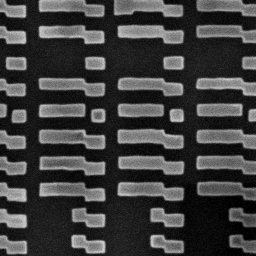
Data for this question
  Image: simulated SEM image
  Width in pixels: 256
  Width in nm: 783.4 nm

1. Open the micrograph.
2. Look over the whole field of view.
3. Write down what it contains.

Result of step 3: wiring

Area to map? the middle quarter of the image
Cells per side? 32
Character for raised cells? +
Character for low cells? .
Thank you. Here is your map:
......++++...............+++++..
................................
................................
................................
+++++.........+++++++++++.......
++++++++++....++++++++++++++++..
.....+++++..............++++++..
.....+++++...............+++++..
................................
................................
+++++.........+++++++++++.......
+++++..+++....+++++++++++..+++..
+++++..+++....+++++++++++..+++..
.......+++.................+++..
........++......................
................................
................................
++++++........++++++++++++......
++++++++++....++++++++++++++++..
++++++++++....++++++++++++++++..
.....+++++...............+++++..
................................
................................
+++++.........+++++++++++.......
++++++........++++++++++++......
++++++++++....++++++++++++++++..
.....+++++...............+++++..
.....+++++...............+++++..
................................
................................
+++++.........+++++++++++.......
++++++++++....++++++++++++++++..